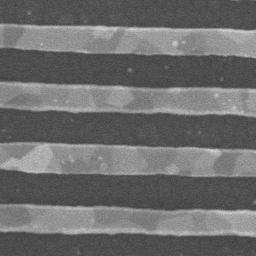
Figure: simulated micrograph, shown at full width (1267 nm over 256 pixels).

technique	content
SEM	lines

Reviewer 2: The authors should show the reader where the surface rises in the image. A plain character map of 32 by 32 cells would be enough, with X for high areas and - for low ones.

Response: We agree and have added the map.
--------------------------------
--------------------------------
--------------------------------
XXXXXXXXXXXXXXXX----------------
XXXXXXXXXXXXXXXXXXXXXXXXXXXXXXXX
XXXXXXXXXXXXXXXXXXXXXXXXXXXXXXXX
----------XXXXXXXXXXXXXXXXXXXXXX
--------------------------------
--------------------------------
--------------------------------
XXX-----------------------------
XXXXXXXXXXXXXXXXXXXXXXXXXXXXXXXX
XXXXXXXXXXXXXXXXXXXXXXXXXXXXXXXX
-XXXXXXXXXXXXXXXXXXXXXXXXXXXXXXX
-------------------------------X
--------------------------------
--------------------------------
--------------------------------
XXXXXXXXXXXXXXXXXXXXXXXXX-------
XXXXXXXXXXXXXXXXXXXXXXXXXXXXXXXX
XXXXXXXXXXXXXXXXXXXXXXXXXXXXXXXX
---XXXXXXXXXXXXXXXXXXXXXXXXXXXXX
--------------------------------
--------------------------------
--------------------------------
--------------------------------
XXXXXXXXXXXXXXXXXXXXXXXXXXXXXXXX
XXXXXXXXXXXXXXXXXXXXXXXXXXXXXXXX
XXXXXXXXXXXXXXXXXXXXXXXXXXXXXXXX
-------------------------------X
--------------------------------
--------------------------------